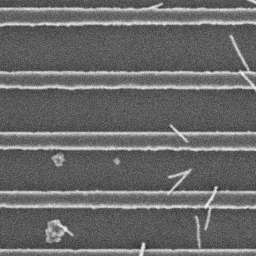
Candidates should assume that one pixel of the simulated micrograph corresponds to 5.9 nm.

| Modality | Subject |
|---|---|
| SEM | lines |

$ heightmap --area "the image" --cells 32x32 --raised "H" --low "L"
LLLLLLLLLLLLLLLLLLLLLLLLLLLLLLLL
HHHHHHHHHHHHHHHHHHHHHHHHHHHHHHHH
HHHHHHHHHHHHHHHHHHHHHHHHHHHHHHHH
LLLLLLLLLLLLLLLLLLLLLLLLLLLLLLLL
LLLLLLLLLLLLLLLLLLLLLLLLLLLLLLLL
LLLLLLLLLLLLLLLLLLLLLLLLLLLLLLLL
LLLLLLLLLLLLLLLLLLLLLLLLLLLLLLLL
LLLLLLLLLLLLLLLLLLLLLLLLLLLLLLLL
LLLLLLLLLLLLLLLLLLLLLLLLLLLLLLLL
HHHHHHHHHHHHHHHHHHHHHHHHHHHHHHHH
HHHHHHHHHHHHHHHHHHHHHHHHHHHHHHHH
LLLLLLLLLLLLLLLLLLLLLLLLLLLLLLLL
LLLLLLLLLLLLLLLLLLLLLLLLLLLLLLLL
LLLLLLLLLLLLLLLLLLLLLLLLLLLLLLLL
LLLLLLLLLLLLLLLLLLLLLLLLLLLLLLLL
LLLLLLLLLLLLLLLLLLLLLLLLLLLLLLLL
LLLLLLLLLLLLLLLLLLLLLLHLLLLLLLLL
HHHHHHHHHHHHHHHHHHHHHHHHHHHHHHHH
HHHHHHHHHHHHHHHHHHHHHHHHHHHHHHHH
LLLLLLLLLLLLLLLLLLLLLLLLLLLLLLLL
LLLLLLLLLLLLLLLLLLLLLLLLLLLLLLLL
LLLLLLLLLLLLLLLLLLLLLLLLLLLLLLLL
LLLLLLLLLLLLLLLLLLLLLLLLLLLLLLLL
LLLLLLLLLLLLLLLLLLLLLLLLLLLLLLLL
HHHHHHHHHHHHHHHHHHHHHHHHHHHHHHHH
HHHHHHHHHHHHHHHHHHHHHHHHHHHHHHHH
LLLLLLLLLLLLLLLLLLLLLLLLLLLLLLLL
LLLLLLLLLLLLLLLLLLLLLLLLLLLLLLLL
LLLLLLHLLLLLLLLLLLLLLLLLLLLLLLLL
LLLLLLLLLLLLLLLLLLLLLLLLLLLLLLLL
LLLLLLLLLLLLLLLLLLLLLLLLLLLLLLLL
HHHHHHHHHHHHHHHHHHHHHHHHHHHHHHHH